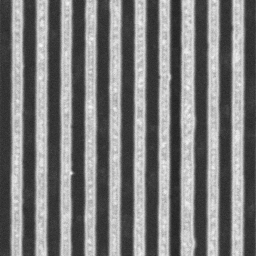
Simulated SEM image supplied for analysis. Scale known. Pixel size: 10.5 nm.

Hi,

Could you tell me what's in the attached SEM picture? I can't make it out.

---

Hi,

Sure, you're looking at parallel lines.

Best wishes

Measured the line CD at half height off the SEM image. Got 114 nm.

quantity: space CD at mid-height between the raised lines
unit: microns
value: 0.15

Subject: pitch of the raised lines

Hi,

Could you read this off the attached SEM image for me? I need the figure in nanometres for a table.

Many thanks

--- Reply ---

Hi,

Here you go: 256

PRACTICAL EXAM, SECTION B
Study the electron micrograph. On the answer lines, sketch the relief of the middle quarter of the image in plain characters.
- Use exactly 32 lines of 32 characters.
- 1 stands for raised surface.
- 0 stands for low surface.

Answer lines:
11000111000011000011000011000111
11000111000011000011000011000111
11000111000011000011000011000111
11000111000011000011000011000111
11000111000011000011000011000111
11000111000011000011000011000111
11000111000011000011000011000111
11000111000011000011000011000111
11000111000011000011000011000111
11000111000011000011000011000111
11000111000011000011000011000111
11000111000011000011000011000111
11000111000011000011000011000111
11000111000011000011000011000111
11000111000011000011000011000111
11000111000011000011000011000111
11000111000011000011000011000111
11000111000011000011000011000111
11000111000011000011000011000111
11000111000011000011000011000111
11000111000011000011000011000111
11000111000111000011000011000111
11000111000111000011000011000111
11000111000111000011000011000111
11000111000111000011000011000111
11000111000111000011000011000111
11000111000111000011000011000111
11000111000111000011000011000111
11000111000111000011000011000111
10000111000111000011000011000111
10000011000111000011000011000111
10000011000111000011000011000111